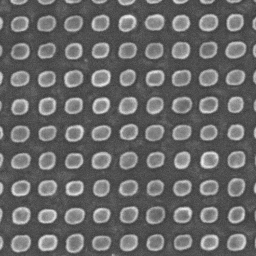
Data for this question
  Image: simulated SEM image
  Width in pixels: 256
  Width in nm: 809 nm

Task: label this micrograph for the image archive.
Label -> a regular array of raised bodies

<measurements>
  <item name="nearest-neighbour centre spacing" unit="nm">84.6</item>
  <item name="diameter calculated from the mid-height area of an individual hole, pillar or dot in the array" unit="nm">51.9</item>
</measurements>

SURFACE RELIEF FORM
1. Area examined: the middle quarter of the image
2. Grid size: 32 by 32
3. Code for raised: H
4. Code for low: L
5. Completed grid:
LLLLLLLLLLLLLLLLLLLLLLLLLLLLLLLL
LLLLLLLLLLLLLLLLLLLLLLLLLLLLLLLL
LHHHLLLHHHHLLLHHHHLLLHHHHLLLHHHL
HHHHLLLHHHHLLLHHHHLLLHHHHLLHHHHL
HHHHLLLHHHHLLLHHHLLLLHHHHLLHHHHL
LLLLLLLLLLLLLLLLLLLLLLLLLLLLLLLL
LLLLLLLLLLLLLLLLLLLLLLLLLLLLLLLL
LLLLLLLLLLLLLLLLLLLLLLLLLLLLLLLL
LLLLLLLLLLLLLLLHHHLLLLLLLLLLLLLL
LHHHLLLLHHHLLLHHHHLLLHHHLLLHHHHH
LHHHHLLHHHHLLLHHHHLLLHHHHLLHHHHH
LHHHLLLHHHHLLLHHHHLLLHHHLLLHHHHL
LLLLLLLLLLLLLLLLLLLLLLLLLLLLLLLL
LLLLLLLLLLLLLLLLLLLLLLLLLLLLLLLL
LLLLLLLLLLLLLLLLLLLLLLLLLLLLLLLL
LLLLLLLLLHLLLLLHHHLLLLHHLLLLLLLL
LHHHHLLHHHHHLLHHHHLLLHHHHLLLHHHL
LHHHHLLHHHHLLLHHHHLLLHHHHLLHHHHL
LHHHLLLLHHHLLLLHHHLLLHHHLLLLHHHL
LLLLLLLLLLLLLLLLLLLLLLLLLLLLLLLL
LLLLLLLLLLLLLLLLLLLLLLLLLLLLLLLL
LLLLLLLLLLLLLLLLLLLLLLLLLLLLLLLL
LLHHLLLLHHHLLLLHHHLLLLHHHLLLLHHL
LHHHHLLHHHHLLLHHHHLLLHHHHLLLHHHL
LHHHLLLHHHHLLLHHHHLLLHHHHLLLHHHL
LHHHLLLHHHHLLLHHHHLLLHHLLLLLHHHL
LLLLLLLLLLLLLLLLLLLLLLLLLLLLLLLL
LLLLLLLLLLLLLLLLLLLLLLLLLLLLLLLL
LLLLLLLLLLLLLLLLLLLLLLLLLLLLLLLL
LLHHLLLLHHHLLLLHHHLLLLHHLLLLHHHL
LHHHHLLLHHHLLLHHHHLLLHHHHLLLHHHH
LHHHHLLLHHHLLLHHHHLLLHHHHLLLHHHH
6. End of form